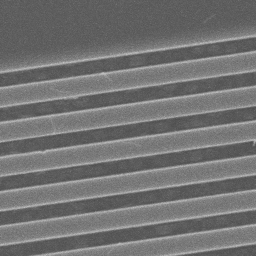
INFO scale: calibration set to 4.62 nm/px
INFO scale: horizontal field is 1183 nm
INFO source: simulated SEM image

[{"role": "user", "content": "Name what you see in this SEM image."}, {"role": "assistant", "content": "parallel lines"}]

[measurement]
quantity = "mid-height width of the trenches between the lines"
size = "0.0681 microns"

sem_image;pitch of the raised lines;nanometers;158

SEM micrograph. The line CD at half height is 88.6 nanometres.